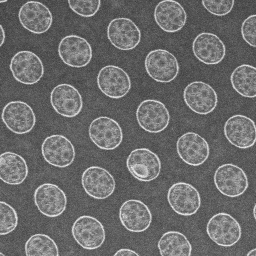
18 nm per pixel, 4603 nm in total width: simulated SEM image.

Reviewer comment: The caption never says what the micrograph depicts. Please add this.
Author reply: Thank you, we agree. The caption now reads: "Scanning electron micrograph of a regular array of raised bodies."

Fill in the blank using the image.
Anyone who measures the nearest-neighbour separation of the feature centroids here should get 49.6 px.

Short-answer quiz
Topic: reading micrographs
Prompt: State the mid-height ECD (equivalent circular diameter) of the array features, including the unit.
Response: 31.1 px